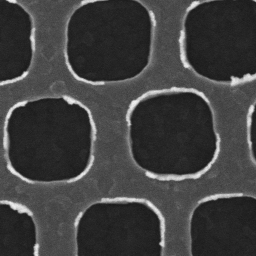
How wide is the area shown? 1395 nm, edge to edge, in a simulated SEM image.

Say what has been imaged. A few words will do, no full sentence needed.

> holes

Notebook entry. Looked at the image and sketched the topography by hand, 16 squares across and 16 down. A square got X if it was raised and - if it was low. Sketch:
-XXXX----XXX----
--XX-----XXX----
--XX-----XXX----
--XX-----XXX----
--XXX----XXX----
XXXXXXXXXXXXXXXX
XX---XXXX----XXX
X-----XX-----XXX
------XX-----XXX
X-----XX-----XXX
X----XXXX----XXX
XXXXXXXXXXXXXXXX
XXXXXXXXXXXXX---
--XXX-----XX----
--XXX-----XX----
--XXX-----XX----